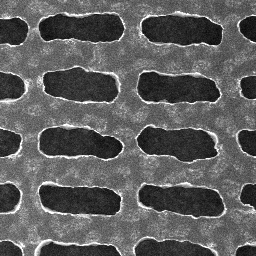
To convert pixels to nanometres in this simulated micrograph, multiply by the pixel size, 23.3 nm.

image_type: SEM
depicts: a regular array of holes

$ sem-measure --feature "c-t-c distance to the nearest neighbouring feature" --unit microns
1.34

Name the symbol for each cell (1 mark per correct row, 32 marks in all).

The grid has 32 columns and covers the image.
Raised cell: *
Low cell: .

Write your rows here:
********************************
********************************
...**..........***........****..
....*..........***..........**..
...**..........***..........***.
...*******************..**.*****
********************************
********************************
*********.**********************
..***.........****.......******.
...**..........**..........***..
...***.........**..........***..
*********.....****.........*****
********************************
********************************
********************************
..***.......******........****..
...**..........**..........***..
..***..........***.........***..
.*****.*.***...*******.....****.
********************************
********************************
********************************
..***........*****........****..
...**..........**..........***..
..***..........***..........***.
.******........*******......****
********************************
********************************
********************************
..***..**********........*******
...**..........**..........***..